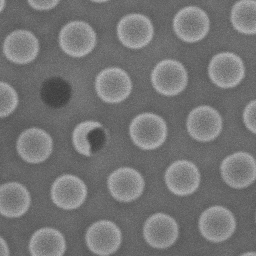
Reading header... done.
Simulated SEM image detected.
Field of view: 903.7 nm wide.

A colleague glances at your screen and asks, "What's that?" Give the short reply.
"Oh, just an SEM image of a regular array of raised bodies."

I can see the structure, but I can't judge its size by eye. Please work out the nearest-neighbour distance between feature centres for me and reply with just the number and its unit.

0.201 micrometres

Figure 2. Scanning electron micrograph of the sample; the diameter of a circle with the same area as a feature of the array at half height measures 120 nanometres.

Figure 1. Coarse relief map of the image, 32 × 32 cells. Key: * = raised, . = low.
....***.......................**
.......................**....***
...............***....****...***
........***....****...****...***
.***....****...****...***.......
.****...****....**..............
.****...***.....................
.***.......................***..
...................****...****..
............****...****...****..
*...........****...****....**...
**..........****....**..........
**...........**.................
**.......................*.....*
.................***....***....*
..........**.....****..*****...*
...**....**.....*****...***.....
..****...**......***.....*......
..****....*.......*.............
...***.......................**.
......................**....****
..............***....****...****
.......***....****...****...****
***....****...****...****.......
****...****...***...............
****...***......................
***.......................***...
..................****...****...
...........****...****...****...
....****...****...****....***...
*...****...****....**...........
*...****....**..................